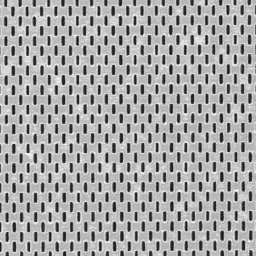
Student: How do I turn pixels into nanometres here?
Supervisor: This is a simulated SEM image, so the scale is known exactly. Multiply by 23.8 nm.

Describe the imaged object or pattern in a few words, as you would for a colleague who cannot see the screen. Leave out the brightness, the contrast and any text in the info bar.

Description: a regular array of holes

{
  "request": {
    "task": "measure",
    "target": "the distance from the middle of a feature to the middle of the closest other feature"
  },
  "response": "280 nm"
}